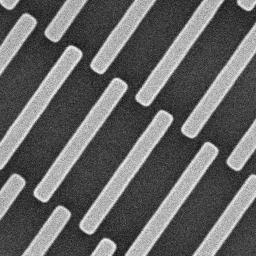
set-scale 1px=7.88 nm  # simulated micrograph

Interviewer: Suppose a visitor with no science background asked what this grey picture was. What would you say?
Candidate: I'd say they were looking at groups of lines, slits or small figures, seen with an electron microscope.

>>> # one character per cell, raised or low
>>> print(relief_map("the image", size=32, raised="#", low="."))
##......###......##......###..##
.......###......##......###.....
..##...##......###......##......
..##..##......###......###......
.##...##......##......###......#
###..........###......##......##
##......##..###......##......###
#......###..##......###......##.
#......##...#......###......###.
......##...........##......###..
.....###......##..###......##...
.....##......###.###......##....
....##......###..##......###....
...###......##..........###.....
..###......##......##...##......
..##......###......##..###......
.##.......##......###..##......#
###......##......###..........##
##......###......##......##..###
#......###......##......###..##.
#......##......###......##...##.
......##.......##......###......
.##..###......##......###......#
###..##......###......##......##
##...#......###......##......###
#...........##......###......##.
#......##..##.......##......###.
......##..###......##......###..
.....###..##......###......##...
.....##..........###......##....
....##......##...##......###....
...###......##..##......###.....